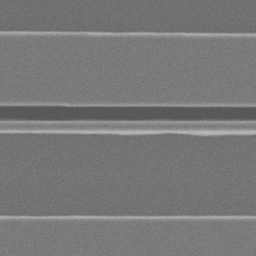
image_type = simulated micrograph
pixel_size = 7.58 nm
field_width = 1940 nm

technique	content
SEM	lines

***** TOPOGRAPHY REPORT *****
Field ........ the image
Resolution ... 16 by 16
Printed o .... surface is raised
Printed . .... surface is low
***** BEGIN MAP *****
................
................
oooooooooooooooo
oooooooooooooooo
oooooooooooooooo
oooooooooooooooo
oooooooooooooooo
................
................
................
................
................
................
................
oooooooooooooooo
oooooooooooooooo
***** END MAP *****